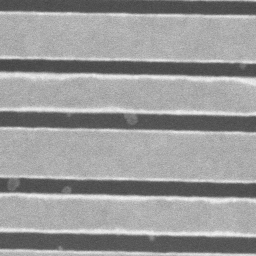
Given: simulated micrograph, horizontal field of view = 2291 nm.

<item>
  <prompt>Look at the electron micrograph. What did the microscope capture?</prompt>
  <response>lines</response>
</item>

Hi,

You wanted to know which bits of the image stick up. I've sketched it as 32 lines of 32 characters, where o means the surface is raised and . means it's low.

................................
................................
oooooooooooooooooooooooooooooooo
oooooooooooooooooooooooooooooooo
oooooooooooooooooooooooooooooooo
oooooooooooooooooooooooooooooooo
oooooooooooooooooooooooooooooooo
................oooooooooooooooo
................................
oooooooooooooooooooooooo........
oooooooooooooooooooooooooooooooo
oooooooooooooooooooooooooooooooo
oooooooooooooooooooooooooooooooo
oooooooooooooooooooooooooooooooo
................................
................................
oooooooooooooooooooooooooo......
oooooooooooooooooooooooooooooooo
oooooooooooooooooooooooooooooooo
oooooooooooooooooooooooooooooooo
oooooooooooooooooooooooooooooooo
oooooooooooooooooooooooooooooooo
.................ooooooooooooooo
................................
oooooooooooooooooo..............
oooooooooooooooooooooooooooooooo
oooooooooooooooooooooooooooooooo
oooooooooooooooooooooooooooooooo
oooooooooooooooooooooooooooooooo
..........................oooooo
................................
oooooooooooooooo................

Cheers